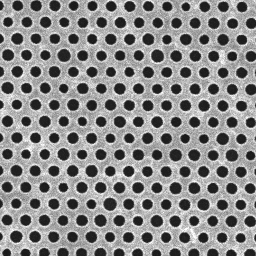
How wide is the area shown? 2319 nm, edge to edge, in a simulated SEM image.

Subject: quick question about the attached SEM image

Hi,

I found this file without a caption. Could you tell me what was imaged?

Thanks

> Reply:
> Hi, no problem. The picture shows a regular array of holes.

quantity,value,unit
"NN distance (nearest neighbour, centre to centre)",18.6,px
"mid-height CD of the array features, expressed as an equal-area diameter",0.101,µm